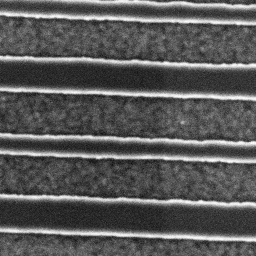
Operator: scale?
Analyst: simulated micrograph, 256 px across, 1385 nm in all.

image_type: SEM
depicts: lines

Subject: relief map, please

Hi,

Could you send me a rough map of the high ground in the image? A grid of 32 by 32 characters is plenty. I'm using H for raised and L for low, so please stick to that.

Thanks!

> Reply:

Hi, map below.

HHHHHHHHHHHHHHHHHHHHHHHHLLLLLLLL
HHHHHHHHHHHHHHHHHHHHHHHHHHHHHHHH
LLLLLLLLLLLLLLLHHHHHHHHHHHHHHHHH
LLLLLLLLLLLLLLLLLLLLLLLLLLLLLLLL
LLLLLLLLLLLLLLLLLLLLLLLLLLLLLLLL
LLLLLLLLLLLLLLLLLLLLLLLLLLLLLLLL
LLLLLLLLLLLLLLLLLLLLLLLLLLLLLLLL
HHHHHHHHHHHHHLLLLLLLLLLLLLLLLLLL
HHHHHHHHHHHHHHHHHHHHHHHHHHHHHHHH
HHHHHHHHHHHHHHHHHHHHHHHHHHHHHHHH
HHHHHHHHHHHHHHHHHHHHHHHHHHHHHHHH
LLLLLHHHHHHHHHHHHHHHHHHHHHHHHHHH
LLLLLLLLLLLLLLLLLLLLLLLLLLLLLLLL
LLLLLLLLLLLLLLLLLLLLLLLLLLLLLLLL
LLLLLLLLLLLLLLLLLLLLLLLLLLLLLLLL
LLLLLLLLLLLLLLLLLLLLLLLLLLLLLLLL
LLLLLLLLLLLLLLLLLLLLLLLLLLLLLLLL
HHHHHHHHHHHHHHHHHHHHHHLLLLLLLLLL
HHHHHHHHHHHHHHHHHHHHHHHHHHHHHHHH
LLLLLLLHHHHHHHHHHHHHHHHHHHHHHHHH
LLLLLLLLLLLLLLLLLLLLLLLLLLLLLLLL
LLLLLLLLLLLLLLLLLLLLLLLLLLLLLLLL
LLLLLLLLLLLLLLLLLLLLLLLLLLLLLLLL
LLLLLLLLLLLLLLLLLLLLLLLLLLLLLLLL
HHHLLHLLLLLLLLLLLLLLLLLLLLLLLLLL
HHHHHHHHHHHHHHHHHHHHHHHHHHHHHHHH
HHHHHHHHHHHHHHHHHHHHHHHHHHHHHHHH
HHHHHHHHHHHHHHHHHHHHHHHHHHHHHHHH
HHHHHHHHHHHHHHHHHHHHHHHHHHHHHHHH
LLLLLLLLLLLLLLLLLLHHHHHHHHHHHHHH
LLLLLLLLLLLLLLLLLLLLLLLLLLLLLLLL
LLLLLLLLLLLLLLLLLLLLLLLLLLLLLLLL